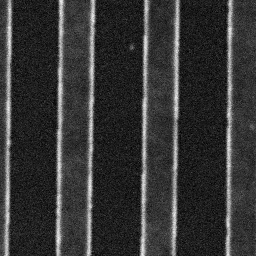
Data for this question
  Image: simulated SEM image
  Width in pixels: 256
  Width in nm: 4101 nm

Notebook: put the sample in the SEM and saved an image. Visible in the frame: lines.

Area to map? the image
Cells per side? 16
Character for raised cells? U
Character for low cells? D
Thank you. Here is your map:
UDDDUUDDDUUDDDUU
UDDDUUDDDUUDDDUU
UDDDUUDDDUUDDDUU
UDDDUUDDDUUDDDUU
UDDDUUDDDUUDDDUU
UDDDUUDDDUUDDDUU
UDDDUUDDDUUDDDUU
UDDDUUDDDUUDDDUU
UDDDUUDDDUUDDDUU
UDDDUUDDDUUDDDUU
UDDDUUDDDUUDDDUU
UDDDUUDDDUUDDDUU
UDDDUUDDDUUDDDUU
DDDDUUDDDUUDDDUU
DDDDUUDDDUUDDDUU
DDDDUUDDDUUDDDUU